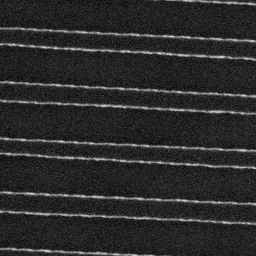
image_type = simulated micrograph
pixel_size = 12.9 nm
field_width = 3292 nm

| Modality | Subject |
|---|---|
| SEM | lines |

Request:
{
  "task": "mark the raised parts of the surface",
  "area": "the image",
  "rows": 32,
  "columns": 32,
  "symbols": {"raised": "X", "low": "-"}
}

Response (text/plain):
-------------------------------X
--------------------------------
--------------------------------
--------------------------------
XXXXXXXXXXXXXXXXXXX-------------
XXXXXXXXXXXXXXXXXXXXXXXXXXXXXXXX
----------------XXXXXXXXXXXXXXXX
--------------------------------
--------------------------------
--------------------------------
XXXX----------------------------
XXXXXXXXXXXXXXXXXXXXXXX---------
XXXXXXXXXXXXXXXXXXXXXXXXXXXXXXXX
------------------XXXXXXXXXXXXXX
--------------------------------
--------------------------------
--------------------------------
XXXX----------------------------
XXXXXXXXXXXXXXXXXXXXXXXX--------
----XXXXXXXXXXXXXXXXXXXXXXXXXXXX
-----------------------XXXXXXXXX
--------------------------------
--------------------------------
--------------------------------
XXXXXXXXX-----------------------
XXXXXXXXXXXXXXXXXXXXXXXXXXXXXXXX
-XXXXXXXXXXXXXXXXXXXXXXXXXXXXXXX
----------------------XXXXXXXXXX
--------------------------------
--------------------------------
--------------------------------
XXXXXXXX------------------------